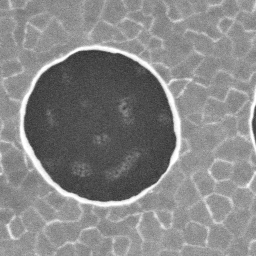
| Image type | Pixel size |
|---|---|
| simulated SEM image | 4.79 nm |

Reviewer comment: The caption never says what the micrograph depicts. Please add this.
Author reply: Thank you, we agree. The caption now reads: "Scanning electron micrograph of holes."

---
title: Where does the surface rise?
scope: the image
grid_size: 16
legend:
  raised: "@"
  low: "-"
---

@@@@@@@@@@@@@@@@
@@@@@@@@@@@@@@@@
@@@@@@@@@@@@@@@@
@@@@----@@@@@@@@
@@@-------@@@@@@
@@--------@@@@@@
@@---------@@@@@
@----------@@@@@
@@---------@@@@@
@@---------@@@@@
@@@-------@@@@@@
@@@-------@@@@@@
@@@@@---@@@@@@@@
@@@@@@@@@@@@@@@@
@@@@@@@@@@@@@@@@
@@@@@@@@@@@@@@@@